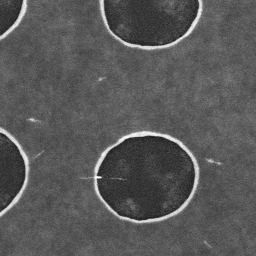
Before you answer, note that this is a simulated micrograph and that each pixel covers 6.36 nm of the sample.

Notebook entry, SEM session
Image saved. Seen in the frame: holes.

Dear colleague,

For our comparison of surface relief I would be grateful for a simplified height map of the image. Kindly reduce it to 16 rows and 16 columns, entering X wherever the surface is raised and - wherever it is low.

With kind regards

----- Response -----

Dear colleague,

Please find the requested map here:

-XXXXX------XXXX
-XXXXXX-----XXXX
XXXXXXXX---XXXXX
XXXXXXXXXXXXXXXX
XXXXXXXXXXXXXXXX
XXXXXXXXXXXXXXXX
XXXXXXXXXXXXXXXX
XXXXXXXXXXXXXXXX
-XXXXXXX--XXXXXX
-XXXXXX-----XXXX
--XXXX------XXXX
--XXXX------XXXX
-XXXXX------XXXX
XXXXXXXX--XXXXXX
XXXXXXXXXXXXXXXX
XXXXXXXXXXXXXXXX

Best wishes